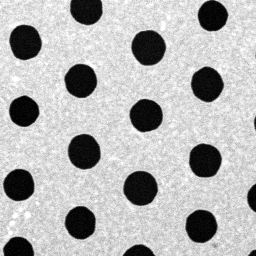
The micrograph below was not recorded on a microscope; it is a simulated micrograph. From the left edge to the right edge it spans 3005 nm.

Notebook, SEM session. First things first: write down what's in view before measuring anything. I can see a regular array of holes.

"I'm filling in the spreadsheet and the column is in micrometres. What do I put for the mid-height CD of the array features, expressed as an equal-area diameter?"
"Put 0.393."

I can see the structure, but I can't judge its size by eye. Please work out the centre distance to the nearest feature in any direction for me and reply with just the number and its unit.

0.792 micrometres